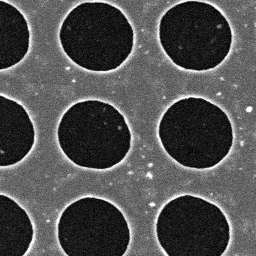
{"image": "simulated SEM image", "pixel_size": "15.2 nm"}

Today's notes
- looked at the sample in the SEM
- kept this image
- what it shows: holes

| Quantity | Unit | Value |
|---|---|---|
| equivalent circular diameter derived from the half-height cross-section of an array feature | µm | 1.09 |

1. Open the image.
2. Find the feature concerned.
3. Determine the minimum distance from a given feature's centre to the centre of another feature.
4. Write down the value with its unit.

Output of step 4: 1490 nm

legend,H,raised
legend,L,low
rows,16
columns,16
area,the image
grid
LHHHHLLHHHHLLHHH
LLHHLLLLHHLLLLHH
LLHHLLLLHHLLLLHH
LLHHLLLLHHHLLLHH
HHHHHHHHHHHHHHHH
HHHHHHHHHHHHHHHH
LHHHHLLHHHHLLHHH
LLHHLLLLHHLLLLHH
LLHHLLLLHHLLLLLH
LLHHLLLLHHLLLLHH
HHHHHHLHHHHHLHHH
HHHHHHHHHHHHHHHH
LHHHHLHHHHHLLHHH
LLHHLLLLHHLLLLHH
LLHHLLLLHHLLLLHH
LLHHLLLLHHLLLLHH